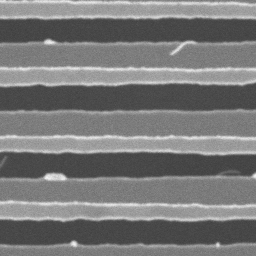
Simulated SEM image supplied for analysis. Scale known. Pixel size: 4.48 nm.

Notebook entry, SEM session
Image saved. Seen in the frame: lines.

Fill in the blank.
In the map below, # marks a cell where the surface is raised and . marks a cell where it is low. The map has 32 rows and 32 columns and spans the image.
################################
################################
................................
................................
................................
################################
################################
################################
################################
################################
################.........######.
................................
................................
................................
################################
################################
################################
################################
################################
................................
................................
................................
################################
################################
################################
################################
################################
.......##.............###.......
................................
................................
........##......................
################################